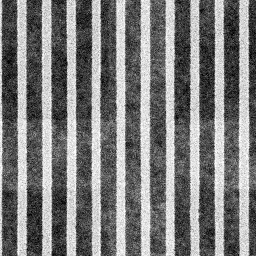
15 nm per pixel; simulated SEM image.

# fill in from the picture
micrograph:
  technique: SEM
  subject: parallel lines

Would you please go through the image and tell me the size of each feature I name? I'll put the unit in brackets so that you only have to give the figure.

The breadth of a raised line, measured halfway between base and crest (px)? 8.25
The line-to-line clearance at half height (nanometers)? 250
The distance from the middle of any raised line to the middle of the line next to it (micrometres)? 0.37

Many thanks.